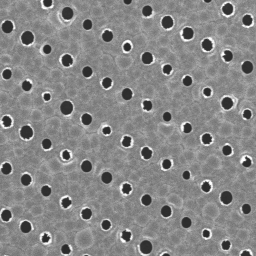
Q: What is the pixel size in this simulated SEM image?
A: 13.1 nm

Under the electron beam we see a regular array of holes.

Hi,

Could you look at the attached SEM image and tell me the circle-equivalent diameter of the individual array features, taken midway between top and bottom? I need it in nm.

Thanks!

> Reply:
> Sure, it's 136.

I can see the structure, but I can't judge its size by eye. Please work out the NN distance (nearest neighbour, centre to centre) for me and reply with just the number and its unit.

297 nanometres